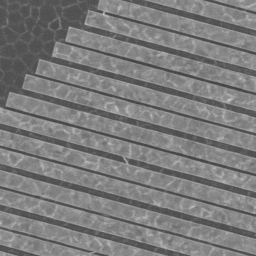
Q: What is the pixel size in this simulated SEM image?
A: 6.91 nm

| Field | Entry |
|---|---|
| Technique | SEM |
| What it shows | parallel lines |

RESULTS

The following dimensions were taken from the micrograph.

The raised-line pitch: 135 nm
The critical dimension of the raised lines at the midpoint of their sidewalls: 0.101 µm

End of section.